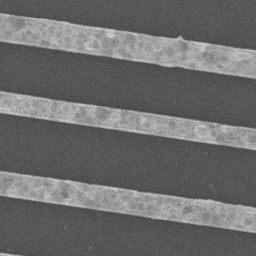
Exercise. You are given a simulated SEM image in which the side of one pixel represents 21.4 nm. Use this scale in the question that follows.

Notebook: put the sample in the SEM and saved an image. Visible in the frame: one or a few lines or trenches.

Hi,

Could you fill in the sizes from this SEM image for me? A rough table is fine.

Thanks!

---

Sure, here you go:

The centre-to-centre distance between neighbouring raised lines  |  1650 nm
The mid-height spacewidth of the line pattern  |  57.7 px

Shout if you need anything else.